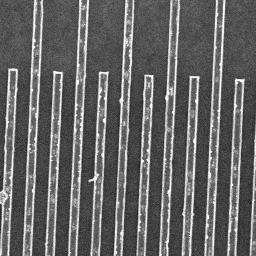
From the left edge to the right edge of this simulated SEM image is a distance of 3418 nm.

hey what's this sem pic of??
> parallel lines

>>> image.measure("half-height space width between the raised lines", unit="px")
14.7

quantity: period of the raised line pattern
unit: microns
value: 0.303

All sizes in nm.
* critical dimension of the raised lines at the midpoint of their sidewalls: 105